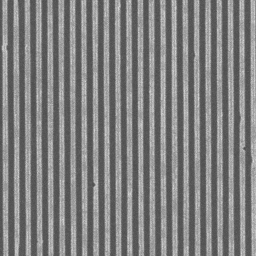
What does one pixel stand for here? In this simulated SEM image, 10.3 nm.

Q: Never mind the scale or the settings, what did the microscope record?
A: parallel lines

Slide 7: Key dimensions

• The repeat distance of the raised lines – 116 nm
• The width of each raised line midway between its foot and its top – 53.9 nm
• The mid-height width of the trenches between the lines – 0.0629 um